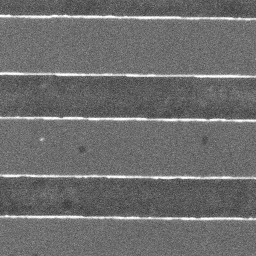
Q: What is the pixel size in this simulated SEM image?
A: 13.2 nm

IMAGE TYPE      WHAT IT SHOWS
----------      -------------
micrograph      lines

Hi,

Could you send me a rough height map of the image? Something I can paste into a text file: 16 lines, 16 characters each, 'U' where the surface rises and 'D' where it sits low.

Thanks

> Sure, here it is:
DDDDDDDDDDDDDDDD
UUUUUUUUUUUUUUUU
UUUUUUUUUUUUUUUU
UUUUUUUUUUUUUUUU
UUUUUUUUUUUUUUUU
DDDDDDDDDDDDDDDD
DDDDDDDDDDDDDDDD
UUUUUUUUUUUUUUUD
UUUUUUUUUUUUUUUU
UUUUUUUUUUUUUUUU
UUUUUUUUUUUUUUUU
DDDDDDDDDDDDDDDD
DDDDDDDDDDDDDDDD
UDDDDDDDDDDDDDDD
UUUUUUUUUUUUUUUU
UUUUUUUUUUUUUUUU